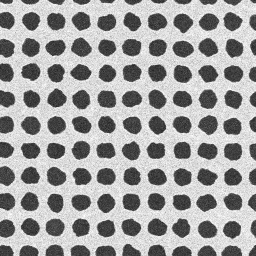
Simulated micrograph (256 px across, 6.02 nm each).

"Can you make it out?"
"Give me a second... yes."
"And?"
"a regular array of holes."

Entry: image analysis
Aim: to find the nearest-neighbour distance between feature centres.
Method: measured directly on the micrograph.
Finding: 0.15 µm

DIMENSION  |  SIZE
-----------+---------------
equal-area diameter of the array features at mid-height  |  0.108 microns